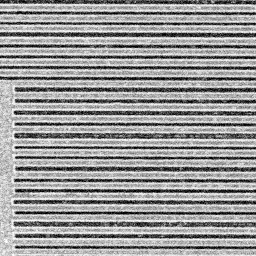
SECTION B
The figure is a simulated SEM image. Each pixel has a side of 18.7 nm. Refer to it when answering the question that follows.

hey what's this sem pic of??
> parallel lines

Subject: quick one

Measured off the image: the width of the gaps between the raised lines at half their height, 0.0864 micrometres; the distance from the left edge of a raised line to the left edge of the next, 0.208 microns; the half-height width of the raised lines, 6.38 pixels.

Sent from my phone